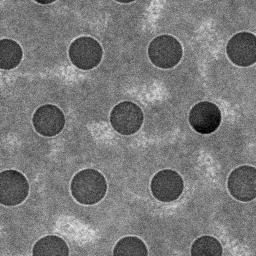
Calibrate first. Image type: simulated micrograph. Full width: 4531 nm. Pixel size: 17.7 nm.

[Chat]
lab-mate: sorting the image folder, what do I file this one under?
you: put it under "holes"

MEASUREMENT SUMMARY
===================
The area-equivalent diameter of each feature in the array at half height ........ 0.612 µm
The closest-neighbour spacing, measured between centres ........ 1360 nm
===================